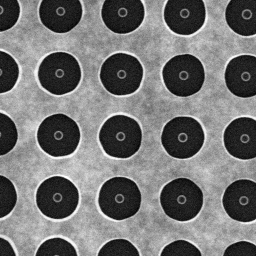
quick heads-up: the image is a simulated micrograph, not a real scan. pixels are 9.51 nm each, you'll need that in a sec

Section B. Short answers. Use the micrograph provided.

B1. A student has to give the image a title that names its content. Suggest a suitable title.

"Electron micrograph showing an array of small figures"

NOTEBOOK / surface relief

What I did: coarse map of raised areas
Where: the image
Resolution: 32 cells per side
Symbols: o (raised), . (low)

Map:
..ooo.....ooo.....ooo.....oo....
...oo.....ooo.....oo......oo....
..ooo.....ooo.....oo......oo....
.ooooo...oooo....oooo....oooo...
oooooooooooooooooooooooooooooo.o
oooooooooooooooooooooooooooooooo
.oooooo.oooooooooooooooooooooooo
..ooo.....ooo....oooo....oooo...
...oo.....ooo.....oo.....ooo....
...oo.....oo......oo......oo....
..ooo.....ooo.....ooo....ooo....
.ooooo...ooooo...oooo....oooo...
oooooooooooooooooooooooooooooooo
oooooooooooooooooooooooooooooooo
.ooooo..oooooo..ooooooo.oooooooo
..ooo.....ooo....oooo....oooo...
..ooo.....oo......oo......oo....
..ooo.....oo......oo......oo....
..ooo.....ooo....ooo.....ooo....
oooooo...ooooo..ooooo...ooooo...
oooooooooooooooooooooooooooooooo
oooooooooooooooooooooooooooooooo
.ooooo...oooo....ooooo..oooooo.o
..ooo.....oo.....ooo.....ooo....
..oo......oo......oo.....ooo....
..ooo.....oo......oo.....ooo....
.oooo....oooo....oooo....ooo....
ooooooo.oooooo.ooooooo..ooooo...
oooooooooooooooooooooooooooooooo
oooooooooooooooooooooooooooooooo
..ooo....oooo....oooo...ooooo...
..ooo.....oo.....ooo.....ooo....